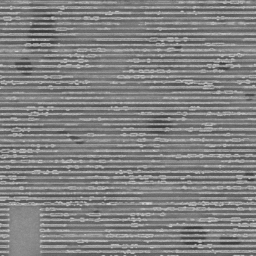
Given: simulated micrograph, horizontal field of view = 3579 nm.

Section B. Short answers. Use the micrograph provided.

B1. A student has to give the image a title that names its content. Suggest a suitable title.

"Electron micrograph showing parallel lines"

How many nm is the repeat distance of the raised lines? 74.1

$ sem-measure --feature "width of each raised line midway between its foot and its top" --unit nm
22.7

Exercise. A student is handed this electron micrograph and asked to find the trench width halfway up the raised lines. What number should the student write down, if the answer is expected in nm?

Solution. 43.7